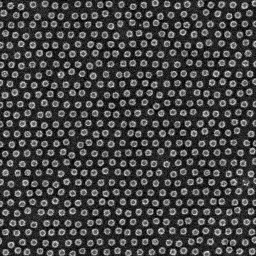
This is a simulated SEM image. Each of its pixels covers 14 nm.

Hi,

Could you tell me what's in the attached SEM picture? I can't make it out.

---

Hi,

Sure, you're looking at a regular array of raised bodies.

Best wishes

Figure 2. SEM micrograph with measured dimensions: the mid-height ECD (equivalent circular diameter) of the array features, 80.7 nm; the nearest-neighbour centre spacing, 0.137 microns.